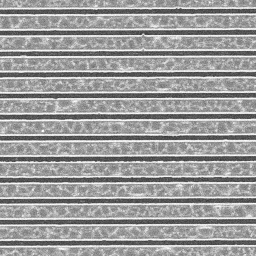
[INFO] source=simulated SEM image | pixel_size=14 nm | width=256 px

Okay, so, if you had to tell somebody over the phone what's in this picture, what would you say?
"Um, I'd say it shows parallel lines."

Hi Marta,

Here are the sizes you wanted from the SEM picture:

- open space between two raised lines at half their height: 96.5 nm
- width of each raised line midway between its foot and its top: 14.6 pixels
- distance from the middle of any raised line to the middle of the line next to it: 295 nanometers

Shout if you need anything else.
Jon